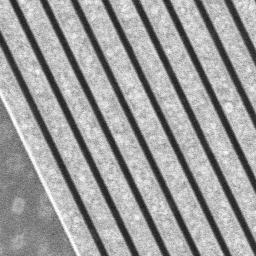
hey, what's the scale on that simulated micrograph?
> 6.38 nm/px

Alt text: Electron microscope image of parallel lines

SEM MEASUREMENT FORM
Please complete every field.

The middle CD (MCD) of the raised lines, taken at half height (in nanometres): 129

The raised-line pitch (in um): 0.177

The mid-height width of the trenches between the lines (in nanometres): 46.7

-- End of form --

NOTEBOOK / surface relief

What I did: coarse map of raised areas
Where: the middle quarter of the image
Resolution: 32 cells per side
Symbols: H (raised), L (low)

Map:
HHLLHHHHHLLHHHHHHLLHHHHHHLLHHHHH
HHLLHHHHHHLLHHHHHHLLHHHHHLLHHHHH
HHHLLHHHHHLLHHHHHHLLHHHHHHLLHHHH
HHHLLHHHHHHLLHHHHHHLLHHHHHLLHHHH
HHHHLLHHHHHLLHHHHHHLLHHHHHHLLHHH
HHHHLLHHHHHHLLHHHHHHLLHHHHHLLHHH
HHHHHLLHHHHHLLHHHHHHLLHHHHHHLLHH
HHHHHLLHHHHHHLLHHHHHHLLHHHHHLLHH
HHHHHHLLHHHHHLLHHHHHHLLHHHHHHLLH
LHHHHHLLHHHHHHLLHHHHHLLLHHHHHLLH
LHHHHHLLLHHHHHLLHHHHHHLLHHHHHHLL
LHHHHHHLLHHHHHHLLHHHHHLLLHHHHHLL
LLHHHHHLLLHHHHHLLHHHHHHLLHHHHHHL
LLHHHHHHLLHHHHHHLLHHHHHLLLHHHHHL
HLLHHHHHLLLHHHHHLLHHHHHHLLHHHHHL
HLLHHHHHHLLHHHHHLLLHHHHHLLLHHHHH
HHLLHHHHHLLLHHHHHLLHHHHHHLLHHHHH
HHLLHHHHHHLLHHHHHLLLHHHHHLLHHHHH
HHHLLHHHHHLLHHHHHHLLHHHHHHLLHHHH
HHHLLHHHHHHLLHHHHHLLLHHHHHLLHHHH
HHHHLLHHHHHLLHHHHHHLLHHHHHHLLHHH
HHHHLLHHHHHHLLHHHHHLLLHHHHHLLHHH
HHHHHLLHHHHHLLHHHHHHLLHHHHHHLLHH
HHHHHLLHHHHHHLLHHHHHLLHHHHHHLLHH
HHHHHHLLHHHHHLLHHHHHHLLHHHHHHLLH
LHHHHHLLHHHHHHLLHHHHHLLHHHHHHLLH
LHHHHHHLLHHHHHLLHHHHHHLLHHHHHHLL
LLHHHHHLLHHHHHHLLHHHHHLLHHHHHHLL
LLHHHHHHLLHHHHHLLHHHHHHLLHHHHHHL
LLHHHHHHLLHHHHHHLLHHHHHLLLHHHHHL
HLLHHHHHLLLHHHHHLLHHHHHHLLHHHHHH
HLLLHHHHHLLHHHHHHLLHHHHHLLHHHHHH